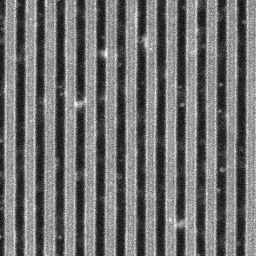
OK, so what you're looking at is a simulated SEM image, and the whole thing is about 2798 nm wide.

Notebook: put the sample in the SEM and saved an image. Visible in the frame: parallel lines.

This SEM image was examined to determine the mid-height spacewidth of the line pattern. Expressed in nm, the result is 84.7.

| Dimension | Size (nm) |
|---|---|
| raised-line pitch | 219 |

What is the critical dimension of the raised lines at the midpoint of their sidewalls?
137 nanometers